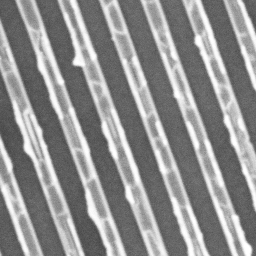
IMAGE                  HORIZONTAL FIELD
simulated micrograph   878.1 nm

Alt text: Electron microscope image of parallel lines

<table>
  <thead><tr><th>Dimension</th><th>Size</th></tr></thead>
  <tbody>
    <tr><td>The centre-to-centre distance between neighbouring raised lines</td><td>134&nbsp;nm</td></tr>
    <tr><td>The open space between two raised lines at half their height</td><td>0.0806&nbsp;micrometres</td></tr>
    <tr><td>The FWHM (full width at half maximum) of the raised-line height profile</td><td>52.8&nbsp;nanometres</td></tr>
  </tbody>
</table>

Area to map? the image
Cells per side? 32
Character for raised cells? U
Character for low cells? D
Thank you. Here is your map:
DDUUDDDUUUDDDUUDDDUUDDDUUDDDUUDD
DDDUUDDDUUDDDUUDDDUUDDDUUUDDDUUD
DDDUUDDDUUDDDUUDDDDUUDDDUUDDDUUD
DDDUUDDDDUDDDDUUDDDUUDDDUUDDDUUU
UDDDUUDDDUUDDDUUDDDUUDDDUUUDDDUU
UDDDUUDDDUUDDDDUDDDDUUDDDUUDDDUU
UDDDUUDDDUUUDDDUUDDDUUDDDUUDDDUU
UUDDDUUDDUUUDDDUUDDDUUDDDUUUDDDU
UUDDDUUDDDUUDDDDUUDDDUUDDDUUDDDU
UUDDDUUUDDDUUDDDUUDDDUUDDDUUDDDU
DUUDDDUUDDDUUDDDUUDDDDUDDDDUUDDD
DUUDDDUUDDDUUDDDDUUDDDUUDDDUUDDD
DUUDDDUUUDDDUUDDDUUDDDUUDDDUUDDD
DDUUDDDUUDDDUUDDDUUDDDDUUDDDUUDD
DDUUDDDUUDDDDUUDDDUUDDDUUDDDUUDD
DDUUUDDDUUDDDUUDDDUUDDDUUDDDUUDD
DDDUUDDDUUDDDUUDDDDUDDDDUUDDDUUD
DDDUUDDDUUUDDUUUDDDUUDDDUUDDDUUD
DDDUUUDDDUUDDDUUDDDUUDDDUUDDDUUD
UDDDUUDDDUUDDDUUDDDDUDDDDUUDDDUU
UDDDUUDDDDUUDDDUUDDDUUDDDUUDDDUU
UUDDDUUDDDUUDDDUUDDDUUDDDUUDDDUU
UUDDDUUDDDUUDDDUUDDDDUUDDDUUDDDU
UUDDDUUDDDDUUDDDUUDDDUUDDDUUDDDU
DUUDDDUUDDDUUDDDUUDDDUUDDDUUDDDD
DUUDDDUUDDDUUDDDUUDDDDUUDDDUUDDD
DUUDDDUUUDDUUUDDDUUDDDUUDDDUUDDD
DDUUDDDUUDDDUUDDDUUDDDUUDDDDUUDD
DDUUDDDUUDDDUUDDDDUUDDDUUDDDUUDD
DDUUDDDDUUDDDUUDDDUUDDDUUDDDUUUD
DDDUUDDDUUDDDUUDDDUUDDDUUDDDDUUD
DDDUUDDDUUDDDUUDDDDUUDDDUUDDDUUD